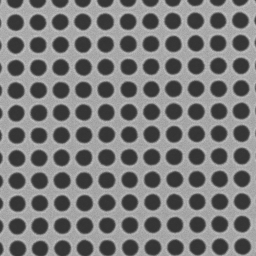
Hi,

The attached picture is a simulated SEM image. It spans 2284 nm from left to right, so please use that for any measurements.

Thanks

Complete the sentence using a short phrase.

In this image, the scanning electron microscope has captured a regular array of holes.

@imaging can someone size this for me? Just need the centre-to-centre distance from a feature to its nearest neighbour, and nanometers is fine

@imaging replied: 199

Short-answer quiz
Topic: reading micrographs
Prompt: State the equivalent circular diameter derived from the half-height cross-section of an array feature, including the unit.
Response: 153 nm